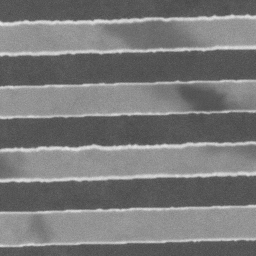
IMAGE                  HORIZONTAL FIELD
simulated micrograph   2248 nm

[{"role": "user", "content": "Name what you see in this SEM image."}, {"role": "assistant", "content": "lines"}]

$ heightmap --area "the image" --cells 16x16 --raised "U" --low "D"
DDDDDDDDDDDDDDDD
UUUUUUUUUUUUUUUU
UUUUUUUUUUUUUUUU
DDDDDDDDDDDDDDDD
DDDDDDDDDDDDDDDD
UUUUUUUUUUUUUUUU
UUUUUUUUUUUUUUUU
DDDDDDDDDDDDDDDD
DDDDDDDDDDDDDDDD
UUUUUUUUUUUUUUUU
UUUUUUUUUUUUUUUU
DDDDDDDDDDDDDDDD
DDDDDDDDDDDDDDDD
UUUUUUUUUUUUUUUU
UUUUUUUUUUUUUUUU
DDDDDDDDDDDDDDDD